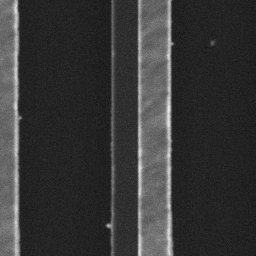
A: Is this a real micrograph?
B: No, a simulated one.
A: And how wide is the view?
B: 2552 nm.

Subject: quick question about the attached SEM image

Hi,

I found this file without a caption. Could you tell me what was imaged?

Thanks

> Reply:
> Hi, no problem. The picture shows lines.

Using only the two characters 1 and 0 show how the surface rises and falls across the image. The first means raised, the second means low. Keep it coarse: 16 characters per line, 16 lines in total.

1000000111100000
1000000111100000
1000000111100000
1000000111100000
1000000111100000
1000000111100000
1000000111100000
1000000111100000
1000000111100000
1000000111100000
1000000111100000
1000000111100000
1000000111100000
1000000111100000
1000000111100000
1000000111100000